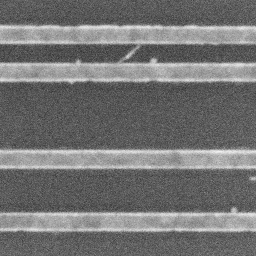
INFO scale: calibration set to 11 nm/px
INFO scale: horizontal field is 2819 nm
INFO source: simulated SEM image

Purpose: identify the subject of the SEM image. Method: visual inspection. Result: lines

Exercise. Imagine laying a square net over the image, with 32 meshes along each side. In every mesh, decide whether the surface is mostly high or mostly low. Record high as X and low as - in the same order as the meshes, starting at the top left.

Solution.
--------------------------------
--------------------------------
--------------------------------
XXXXXXXXXXXXXXXXXXXXXXXXXXXXXXXX
XXXXXXXXXXXXXXXXXXXXXXXXXXXXXXXX
--------------------------------
--------------------------------
--------------------------------
XXXXXXXXXXXXXXXXXXXXXXXXXXXXXXXX
XXXXXXXXXXXXXXXXXXXXXXXXXXXXXXXX
--------------------------------
--------------------------------
--------------------------------
--------------------------------
--------------------------------
--------------------------------
--------------------------------
--------------------------------
--------------------------------
XXXXXXXXXXXXXXXXXXXXXXXXXXXXXXXX
XXXXXXXXXXXXXXXXXXXXXXXXXXXXXXXX
--------------------------------
--------------------------------
--------------------------------
--------------------------------
--------------------------------
--------------------------------
XXXXXXXXXXXXXXXXXXXXXXXXXXXXXXXX
XXXXXXXXXXXXXXXXXXXXXXXXXXXXXXXX
--------------------------------
--------------------------------
--------------------------------